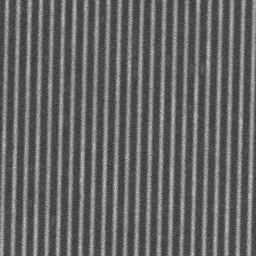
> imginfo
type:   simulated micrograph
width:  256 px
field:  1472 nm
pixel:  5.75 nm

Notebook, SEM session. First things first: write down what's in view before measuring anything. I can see parallel lines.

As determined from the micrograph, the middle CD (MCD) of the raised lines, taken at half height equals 15.8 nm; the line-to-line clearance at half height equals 46.7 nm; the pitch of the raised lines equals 64.6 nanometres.